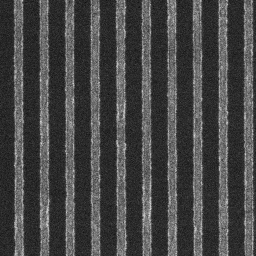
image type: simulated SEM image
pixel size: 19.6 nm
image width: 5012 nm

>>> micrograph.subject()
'parallel lines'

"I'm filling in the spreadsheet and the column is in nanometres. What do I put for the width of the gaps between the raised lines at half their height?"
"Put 127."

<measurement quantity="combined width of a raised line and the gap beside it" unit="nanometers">500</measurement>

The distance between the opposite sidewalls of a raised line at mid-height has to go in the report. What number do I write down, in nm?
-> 370